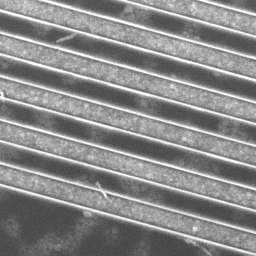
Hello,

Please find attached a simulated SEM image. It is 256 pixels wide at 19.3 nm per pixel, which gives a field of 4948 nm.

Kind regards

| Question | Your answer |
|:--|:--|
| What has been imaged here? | parallel lines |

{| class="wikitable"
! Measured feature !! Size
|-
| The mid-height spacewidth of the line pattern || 392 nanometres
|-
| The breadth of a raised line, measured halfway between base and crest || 429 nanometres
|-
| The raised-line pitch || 813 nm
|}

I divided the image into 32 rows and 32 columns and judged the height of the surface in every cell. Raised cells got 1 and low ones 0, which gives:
00000001111111111000000000011111
10000000001111111111100000000001
11111000000000111111111110000000
11111111000000000011111111110000
01111111111100000000011111111111
00000111111111110000000001111111
00000000011111111110000000000111
11100000000001111111111000000000
11111110000000001111111111100000
11111111110000000000111111111100
00011111111111000000000011111111
00000001111111111100000000011111
11000000000111111111100000000001
11111000000000111111111110000000
11111111100000000011111111111000
00111111111110000000001111111111
00000011111111110000000001111111
00000000011111111111000000000111
11100000000001111111111100000000
11111110000000000111111111100000
11111111111000000000111111111110
00001111111111000000000011111111
00000000111111111100000000001111
10000000000111111111110000000001
11111000000000011111111110000000
11111111100000000001111111111000
11111111111100000000001111111111
11111111111111110000000000111111
11111111111111111111000000000111
11111111111111111111111000000000
11111111111111111111111111100000
11111111111111111111111111111110